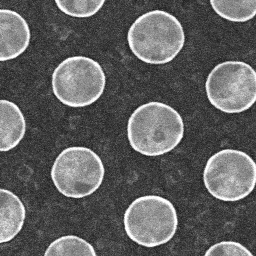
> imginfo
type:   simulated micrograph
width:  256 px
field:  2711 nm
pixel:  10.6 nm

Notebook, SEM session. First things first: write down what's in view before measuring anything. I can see raised bodies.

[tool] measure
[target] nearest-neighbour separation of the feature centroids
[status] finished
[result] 940 nm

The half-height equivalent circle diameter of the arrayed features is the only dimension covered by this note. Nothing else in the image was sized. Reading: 0.528 µm